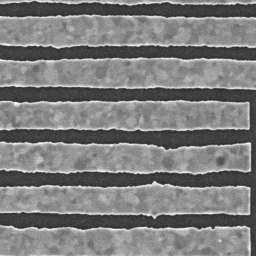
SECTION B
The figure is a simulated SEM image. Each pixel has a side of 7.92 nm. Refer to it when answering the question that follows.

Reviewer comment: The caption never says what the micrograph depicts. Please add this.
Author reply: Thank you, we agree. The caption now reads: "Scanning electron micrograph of parallel lines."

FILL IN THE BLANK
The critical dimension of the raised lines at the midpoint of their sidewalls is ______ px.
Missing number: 28.1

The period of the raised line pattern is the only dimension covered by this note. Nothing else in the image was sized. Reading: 0.335 µm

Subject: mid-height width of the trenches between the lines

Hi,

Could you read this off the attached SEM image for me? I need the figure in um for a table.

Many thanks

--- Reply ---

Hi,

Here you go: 0.112